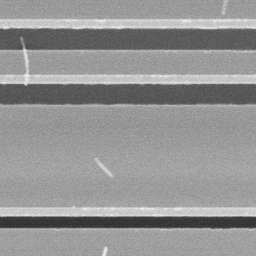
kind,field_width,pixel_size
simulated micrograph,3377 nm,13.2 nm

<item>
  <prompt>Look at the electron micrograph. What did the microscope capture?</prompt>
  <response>lines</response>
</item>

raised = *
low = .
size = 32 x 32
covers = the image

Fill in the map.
********************************
********************************
********************************
*.....*..****.**....*...****...*
................................
................................
********************************
********************************
********************************
********************************
...*.........*..................
................................
................................
********************************
********************************
********************************
********************************
********************************
********************************
********************************
********************************
********************************
********************************
********************************
********************************
********************************
********************************
................................
................................
********************************
********************************
********************************